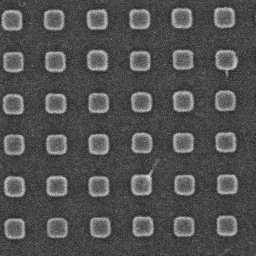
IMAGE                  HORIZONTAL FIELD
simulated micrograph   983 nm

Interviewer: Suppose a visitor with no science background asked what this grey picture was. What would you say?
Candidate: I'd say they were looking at a regular array of raised bodies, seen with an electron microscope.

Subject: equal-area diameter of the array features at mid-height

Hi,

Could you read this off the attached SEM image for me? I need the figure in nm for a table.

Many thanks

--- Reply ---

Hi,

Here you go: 80.3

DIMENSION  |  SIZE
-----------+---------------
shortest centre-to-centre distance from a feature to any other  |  158 nanometers